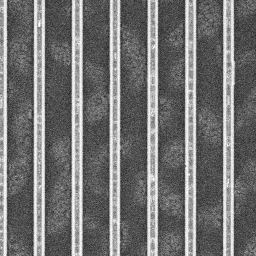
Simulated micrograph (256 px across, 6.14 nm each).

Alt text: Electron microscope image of parallel lines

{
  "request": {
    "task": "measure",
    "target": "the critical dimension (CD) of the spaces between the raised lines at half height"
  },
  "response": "180 nm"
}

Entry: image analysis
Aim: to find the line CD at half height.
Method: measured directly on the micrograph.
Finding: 49.1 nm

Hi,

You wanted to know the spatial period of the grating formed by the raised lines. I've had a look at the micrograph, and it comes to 232 nm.